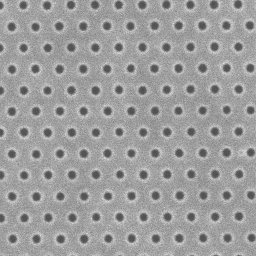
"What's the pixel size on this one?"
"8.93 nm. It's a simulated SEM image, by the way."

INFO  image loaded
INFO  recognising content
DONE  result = a regular array of holes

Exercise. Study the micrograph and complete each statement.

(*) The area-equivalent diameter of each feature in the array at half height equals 74.7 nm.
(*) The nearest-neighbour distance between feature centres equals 0.211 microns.